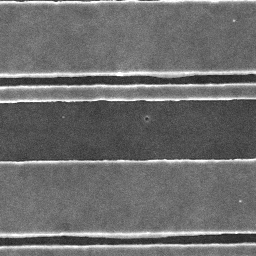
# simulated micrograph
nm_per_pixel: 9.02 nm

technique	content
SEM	lines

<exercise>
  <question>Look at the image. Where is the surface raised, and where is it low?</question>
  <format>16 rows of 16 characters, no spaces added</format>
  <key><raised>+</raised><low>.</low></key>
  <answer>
++++++++++++++++
++++++++++++++++
++++++++++++++++
++++++++++++++++
++++++++++++++++
++++++++++++++++
................
................
................
................
++++++++++++++++
++++++++++++++++
++++++++++++++++
++++++++++++++++
++++++++++++++++
++++++++++++++++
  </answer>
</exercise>